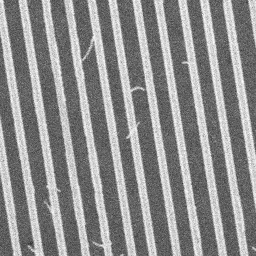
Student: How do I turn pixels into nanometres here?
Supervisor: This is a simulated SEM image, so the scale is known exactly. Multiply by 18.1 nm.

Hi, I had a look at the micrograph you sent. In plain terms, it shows parallel lines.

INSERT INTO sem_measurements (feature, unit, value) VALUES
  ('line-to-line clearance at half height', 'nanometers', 304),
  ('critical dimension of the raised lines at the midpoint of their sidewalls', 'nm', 96.2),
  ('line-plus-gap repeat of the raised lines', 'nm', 407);